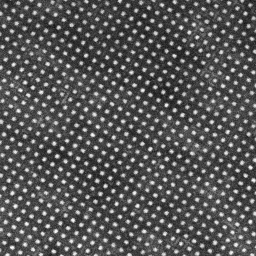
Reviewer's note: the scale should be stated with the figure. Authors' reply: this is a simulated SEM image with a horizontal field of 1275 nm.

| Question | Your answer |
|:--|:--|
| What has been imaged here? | a regular array of raised bodies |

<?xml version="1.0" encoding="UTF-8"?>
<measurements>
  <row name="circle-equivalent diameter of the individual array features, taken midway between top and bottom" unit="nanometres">17.8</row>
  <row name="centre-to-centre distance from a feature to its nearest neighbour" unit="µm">0.0449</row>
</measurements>